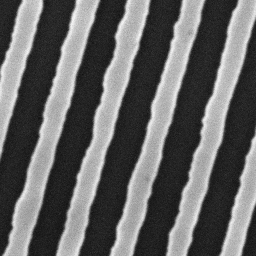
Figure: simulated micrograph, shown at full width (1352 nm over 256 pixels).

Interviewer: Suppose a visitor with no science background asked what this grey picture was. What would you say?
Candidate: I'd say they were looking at lines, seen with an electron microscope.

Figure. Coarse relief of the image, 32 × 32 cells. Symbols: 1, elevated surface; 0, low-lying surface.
00011000001100001110000110000011
00111000011100001100000110000111
00111000011100011100001110000111
00111000011000011100001110000110
00110000111000111100001100001110
01110000111000011000011100001110
01110000110000111000011100001110
01100001110000111000011000001110
11100001110000110000011000011100
11100001110001110000111000011100
11000001100001110000111000011100
11000011100001110000110000011000
11000011100001100001110000111000
11000011100011100001110000110000
10000111000011100001110000110000
10000111000011000001100001110000
10000111000011000011100001110000
10000110000111000011100001110000
00000110000110000011000001100001
00001110000110000011000011100001
00001110001110000111000011100001
00011100001110000111000011000011
00011100001100001110000011000011
00011100011100001110000111000011
00011000011100001110000111000011
00111000011000001100000110000111
00111000111000011100001110000111
00111000111000011100001110000110
00110000111000011100001100000110
01110000110000011000011100001110
01110001110000111000011100001110
01100001110000111000011000001100